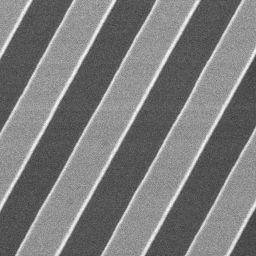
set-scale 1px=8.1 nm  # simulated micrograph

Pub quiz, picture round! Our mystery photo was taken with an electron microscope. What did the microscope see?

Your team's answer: lines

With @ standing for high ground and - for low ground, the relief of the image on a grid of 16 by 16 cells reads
@@--@@@---@@---@
@---@@---@@@--@@
@--@@@--@@@---@@
---@@---@@@--@@@
--@@@--@@@---@@-
--@@---@@---@@@-
-@@@--@@@---@@--
@@@---@@---@@@--
@@@--@@@--@@@---
@@---@@---@@@--@
@@--@@@--@@@---@
@--@@@---@@@--@@
---@@@--@@@---@@
--@@@---@@---@@@
--@@@--@@@--@@@-
-@@@---@@---@@@-